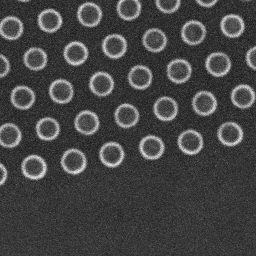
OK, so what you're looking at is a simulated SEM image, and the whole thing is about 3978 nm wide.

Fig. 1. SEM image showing a regular array of raised bodies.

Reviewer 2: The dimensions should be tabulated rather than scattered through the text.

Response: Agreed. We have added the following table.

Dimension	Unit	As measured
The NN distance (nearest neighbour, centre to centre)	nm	610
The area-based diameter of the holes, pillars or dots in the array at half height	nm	343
